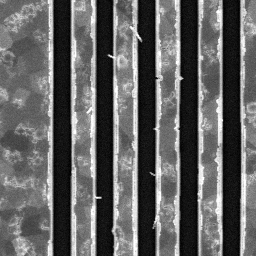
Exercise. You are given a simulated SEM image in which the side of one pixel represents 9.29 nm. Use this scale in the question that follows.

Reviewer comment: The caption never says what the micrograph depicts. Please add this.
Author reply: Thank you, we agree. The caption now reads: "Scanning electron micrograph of parallel lines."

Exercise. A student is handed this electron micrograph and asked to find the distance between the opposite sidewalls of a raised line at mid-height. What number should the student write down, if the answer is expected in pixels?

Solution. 21.6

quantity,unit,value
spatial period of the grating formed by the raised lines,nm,392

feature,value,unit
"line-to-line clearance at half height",0.193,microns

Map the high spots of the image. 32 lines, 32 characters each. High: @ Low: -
@@@@@@---@@@--@@@---@@---@@@--@@
@@@@@@---@@@--@@@---@@---@@@--@@
@@@@@@---@@@--@@@---@@---@@---@@
@@@@@@---@@@--@@@---@@---@@---@@
@@@@@@---@@@--@@@---@@---@@@--@@
@@@@@@---@@@--@@@---@@---@@@--@@
@@@@@@---@@@--@@@---@@---@@@--@@
@@@@@@---@@@--@@@---@@---@@@--@@
@@@@@@---@@@--@@@---@@---@@@--@@
@@@@@@---@@@--@@@---@@---@@@--@@
@@@@@@---@@@--@@@---@@---@@@--@@
@@@@@@@--@@@--@@@---@@---@@@--@@
@@@@@@@--@@@--@@@---@@---@@@--@@
@@@@@@---@@@--@@@---@@---@@@--@@
@@@@@@---@@@---@@---@@---@@@--@@
@@@@@@---@@@---@@---@@---@@@--@@
@@@@@@---@@@---@@---@@---@@@--@@
@@@@@@---@@@---@@---@@---@@@--@@
@@@@@@---@@@---@@---@@---@@@--@@
@@@@@@---@@@--@@@---@@---@@@--@@
@@@@@@---@@@--@@@---@@---@@@--@@
@@@@@@---@@@--@@@---@@---@@@--@@
@@@@@@---@@@--@@@---@@---@@---@@
@@@@@@---@@@--@@@---@@---@@---@@
@@@@@@---@@@--@@@---@@---@@---@@
@@@@@@---@@@--@@@---@@---@@---@@
@@@@@@---@@@--@@@---@@---@@---@@
@@@@@@---@@@---@@---@@---@@@--@@
@@@@@@---@@@--@@@---@@---@@@--@@
@@@@@@---@@@--@@@---@@---@@@--@@
@@@@@@---@@@---@@---@@---@@@--@@
@@@@@@---@@@---@@---@@---@@@--@@